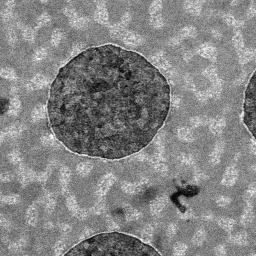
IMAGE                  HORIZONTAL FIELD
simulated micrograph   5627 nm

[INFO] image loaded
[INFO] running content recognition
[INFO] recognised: raised bodies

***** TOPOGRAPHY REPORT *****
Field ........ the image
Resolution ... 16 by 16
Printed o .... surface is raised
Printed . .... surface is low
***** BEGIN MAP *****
................
................
................
.....oooo.......
....oooooo......
...oooooooo....o
...oooooooo....o
...ooooooo.....o
...ooooooo......
.....oooo.......
................
................
................
................
................
....oooooo......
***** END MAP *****